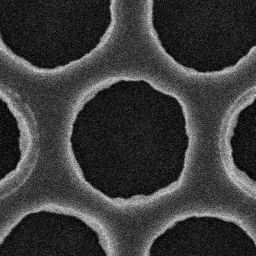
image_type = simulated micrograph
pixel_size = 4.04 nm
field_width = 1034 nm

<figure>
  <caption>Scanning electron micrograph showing holes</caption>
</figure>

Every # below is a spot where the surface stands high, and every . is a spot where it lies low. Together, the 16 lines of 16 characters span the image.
.......###......
.......###......
......####......
#....######....#
################
######....######
#####......#####
.####.......###.
.###........##..
.####.......##..
.####......####.
######.....#####
################
##...#######.###
#.....####.....#
.......##.......